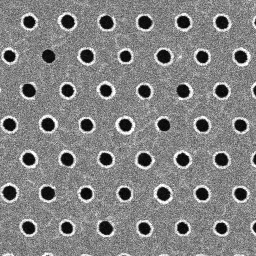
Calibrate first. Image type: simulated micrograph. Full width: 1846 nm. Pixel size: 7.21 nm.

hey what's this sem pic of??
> a regular array of holes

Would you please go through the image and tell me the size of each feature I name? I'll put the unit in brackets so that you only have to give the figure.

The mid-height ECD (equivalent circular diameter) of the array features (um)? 0.0938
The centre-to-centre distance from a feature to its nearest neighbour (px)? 38.3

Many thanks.